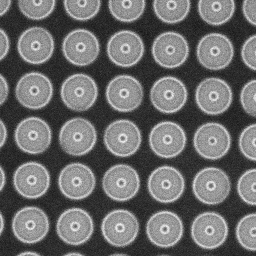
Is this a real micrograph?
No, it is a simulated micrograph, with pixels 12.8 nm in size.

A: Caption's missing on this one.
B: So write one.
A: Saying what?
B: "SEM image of an array of small figures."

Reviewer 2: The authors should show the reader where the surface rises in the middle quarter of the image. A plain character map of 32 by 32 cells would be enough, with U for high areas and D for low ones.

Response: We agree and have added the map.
UUUUUUUUUUUUUUUUUUUUUUUUUUDUUUUU
UUUUUUUUUUUUUUUUUUUUUUUUUUUUUUUU
UUUUUUUUUUUUUUUUUUUUUUUUUUUUUUUU
UUDDDDUUUUUUUUDDUUUUUUUUUUUUUUUU
UDDDDDDUUUUUDDDDDDUUUUUUDDDDDUUU
DDDDDDDDUUUDDDDDDDDUUUUDDDDDDDUU
DDDUUDDDUUUDDDUUDDDUUUDDDDDDDDUU
DDDUUDDDUUUDDDUUDDDUUUDDDUUDDDUU
DDDDDDDDUUUDDDDDDDDUUUDDDDUDDDUU
DDDDDDDUUUUUDDDDDDDUUUDDDDDDDDUU
UDDDDDUUUUUUUDDDDDUUUUUDDDDDDUUU
UUUUUUUUUUUUUUDDUUUUUUUUUDDDUUUU
UUUUUUUUUUUUUUUUUUUUUUUUUUUUUUUU
UUUUUUUUUUUUUUUUUUUUUUUUUUUUUUUU
UDDDDDUUUUUUUDDDUUUUUUUUUUUUUUUU
DDDDDDDUUUUUDDDDDDUUUUUUDDDDUUUU
DDDDDDDUUUUDDDDDDDUUUUUDDDDDDUUU
DDDUDDDDUUUDDDDDDDDUUUDDDDDDDDUU
DDDUDDDDUUDDDDUUDDDUUUDDDUUDDDUU
DDDDDDDUUUUDDDDDDDDUUUDDDUUDDDUU
DDDDDDDUUUUDDDDDDDUUUUDDDDDDDDUU
UDDDDDUUUUUUDDDDDDUUUUUDDDDDDUUU
UUUDUUUUUUUUUDDDUUUUUUUUDDDDUUUU
UUUUUUUUUUUUUUUUUUUUUUUUUUUUUUUU
UUUUUUUUUUUUUUUUUUUUUUUUUUUUUUUU
UUDDDUUUUUUUUUDUUUUUUUUUUUUUUUUU
DDDDDDUUUUUUDDDDDUUUUUUDDDDDUUUU
DDDDDDDUUUUDDDDDDDUUUUDDDDDDDUUU
DDDUDDDUUUDDDDDDDDUUUUDDDDDDDUUU
DDUUDDDUUUDDDUUDDDUUUDDDDUDDDDUU
DDDDDDDUUUDDDDUDDDUUUDDDDUDDDDUU
DDDDDDDUUUDDDDDDDDUUUUDDDDDDDUUU